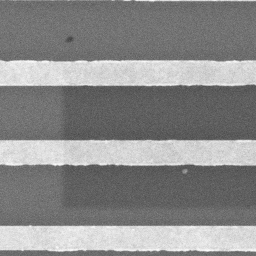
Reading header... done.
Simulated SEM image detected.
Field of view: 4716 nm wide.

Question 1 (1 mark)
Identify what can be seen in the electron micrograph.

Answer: lines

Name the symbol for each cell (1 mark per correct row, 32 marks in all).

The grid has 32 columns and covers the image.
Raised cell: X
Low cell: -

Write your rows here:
--------------------------------
--------------------------------
--------------------------------
--------------------------------
--------------------------------
--------------------------------
--------------------------------
--------------------------------
XXXXXXXXXXXXXXXXXXXXXXXXXXXXXXXX
XXXXXXXXXXXXXXXXXXXXXXXXXXXXXXXX
XXXXXXXXXXXXXXXXXXXXXXXXXXXXXXX-
--------------------------------
--------------------------------
--------------------------------
--------------------------------
--------------------------------
--------------------------------
--------------------------------
XXXXXXXXXXXXXXXXXXXXXXXXXXXXXXXX
XXXXXXXXXXXXXXXXXXXXXXXXXXXXXXXX
XXX-X-XXXXX-XXXXXXXXXXX-XXXXXXXX
--------------------------------
--------------------------------
--------------------------------
--------------------------------
--------------------------------
--------------------------------
--------------------------------
XXXXXXXXXXXXXXXXXXXXXXXXXXXXXXXX
XXXXXXXXXXXXXXXXXXXXXXXXXXXXXXXX
XXXXXXXXXXXXXXXXXXXXXXXXXXXXXXXX
--------------------------------